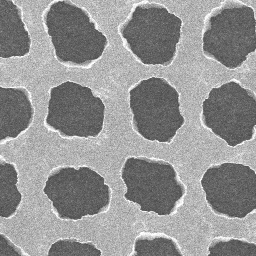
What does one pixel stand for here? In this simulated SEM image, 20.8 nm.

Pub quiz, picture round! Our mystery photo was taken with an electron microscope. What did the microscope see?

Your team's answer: holes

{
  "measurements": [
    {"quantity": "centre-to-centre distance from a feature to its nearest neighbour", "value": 1570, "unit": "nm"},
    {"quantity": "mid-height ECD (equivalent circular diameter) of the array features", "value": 1210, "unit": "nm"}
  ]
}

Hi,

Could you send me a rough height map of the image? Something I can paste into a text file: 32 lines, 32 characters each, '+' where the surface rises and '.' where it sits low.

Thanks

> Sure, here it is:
..+++++..+++++++++.+++++++++..++
...+++.....++++++....++++++.....
...+++.....+++++.......+++......
...+++......+++........+++......
....++.......++........++.......
....+++......+++......+++.......
...++++......++++.....++++......
+++++++.....+++++.....+++++....+
++++++++++++++++++++++++++++++++
++++++++++++++++++++++++++++++++
++++++++..+++++++....+++++++..++
...+++......++++......++++......
....++.......+++......++++......
....++.......+++......+++.......
....++.......++++......++.......
....++.......++++......+++......
...++++.....+++++.....+++++.....
+++++++++++++++++++..+++++++...+
++++++++++++++++++++++++++++++++
++++++++++++++++++++++++++++++++
.+++++++++++++++.....+++++++..++
..+++++.....+++.......++++......
..++++.......++.......+++.......
..++++........++.......++.......
...+++........++.......+++......
..+++++......++++.....++++......
..+++++.....+++++++..++++++....+
++++++++++++++++++++++++++++++++
++++++++++++++++++++++++++++++++
.+++++++++++++++++++++++++++++++
..+++++.....+++++.....++++......
...+++......+++++......+++......